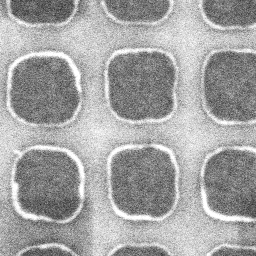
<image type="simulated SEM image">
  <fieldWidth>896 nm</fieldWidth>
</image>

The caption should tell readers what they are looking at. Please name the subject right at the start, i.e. raised bodies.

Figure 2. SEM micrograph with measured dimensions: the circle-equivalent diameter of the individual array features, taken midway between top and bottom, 270 nm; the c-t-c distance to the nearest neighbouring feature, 332 nm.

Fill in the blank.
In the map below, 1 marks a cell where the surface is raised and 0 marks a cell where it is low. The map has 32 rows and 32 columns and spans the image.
01111111110001111111100001111111
01111111100001111111100001111111
00111111100000111111000000111111
00000000000000000000000000011110
00000000000000000000000000000000
00000000000000000000000000000000
00000000000000011111100000011111
00111111100000111111110000111111
01111111110001111111110001111111
01111111110001111111110001111111
01111111110001111111110001111111
01111111110001111111110001111111
01111111110001111111110001111111
01111111110000111111110000111111
00111111100000111111100000111111
00011111000000000000000000000000
00000000000000000000000000000000
00000000000000000000000000000000
00001110000000011111100000001110
00111111100000111111110000111111
00111111110000111111110001111111
00111111110000111111110001111111
00111111110000111111110001111111
00111111110000111111110001111111
00111111110000111111110001111111
00111111110000111111110001111111
00111111110000011111100000111111
00000111100000000000000000000011
00000000000000000000000000000000
00000000000000000000000000000000
00000010000000001000000000000000
00011111100000111111100000111111